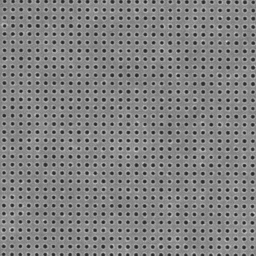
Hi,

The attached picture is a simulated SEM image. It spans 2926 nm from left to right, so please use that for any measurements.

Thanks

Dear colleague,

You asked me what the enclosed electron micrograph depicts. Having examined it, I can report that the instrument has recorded a regular array of holes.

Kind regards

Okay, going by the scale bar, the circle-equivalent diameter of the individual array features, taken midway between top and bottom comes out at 42.8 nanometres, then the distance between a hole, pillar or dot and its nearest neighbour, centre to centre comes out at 91.4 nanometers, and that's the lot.